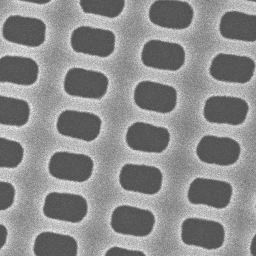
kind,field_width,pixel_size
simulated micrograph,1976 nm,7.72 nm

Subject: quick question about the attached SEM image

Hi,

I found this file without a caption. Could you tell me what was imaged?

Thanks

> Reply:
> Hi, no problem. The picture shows a regular array of holes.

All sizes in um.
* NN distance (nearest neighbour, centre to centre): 0.32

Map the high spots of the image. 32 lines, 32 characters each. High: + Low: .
++++++++++......+++.....++++++++
+++++++++++....++++.....++++..++
+....++++++++++++++.....++++....
......++++..+++++++++..++++.....
......+++.....++++++++++++++....
++...++++.....++++....++++++++++
++++++++++....++++.....+++++++++
....++++++++++++++.....++++.....
.....++++.+++++++++....+++......
.....+++.....+++++++++++++......
++..++++.....++++...++++++++++++
++++++++.....++++.....++++++++++
...++++++++++++++.....++++....++
....++++++++++++++....+++......+
....+++.....++++++++++++++.....+
...++++......++++..+++++++++..++
+++++++.....++++.....+++++++++++
.+++++++++..++++.....++++....+++
...+++++++++++++.....++++.....++
...++++....++++++++++++++.....++
..++++......++++.++++++++++..+++
++++++......+++.....++++++++++++
++++++++...++++.....++++...+++++
..+++++++++++++.....++++.....+++
..++++....+++++++++++++......+++
..++++.....+++++++++++++.....+++
+++++......+++.....+++++++++++++
+++++++...++++.....++++...++++++
.+++++++++++++.....++++.....++++
.++++....++++++++.+++++.....++++
.+++......+++++++++++++.....+++.
++++......+++.....+++++++++++++.